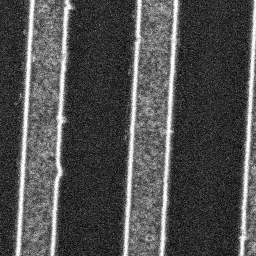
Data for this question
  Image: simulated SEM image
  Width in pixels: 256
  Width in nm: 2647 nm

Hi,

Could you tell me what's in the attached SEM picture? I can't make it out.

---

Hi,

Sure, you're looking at one or a few lines or trenches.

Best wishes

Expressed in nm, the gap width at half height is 789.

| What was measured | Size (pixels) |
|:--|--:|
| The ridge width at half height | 35.7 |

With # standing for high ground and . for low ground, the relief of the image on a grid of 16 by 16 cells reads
..##.....##.....
..##.....##.....
..##.....##.....
..##.....##.....
..##....###.....
..##....###.....
..##....###.....
..##....###.....
..##....###.....
.###....##.....#
.###....##.....#
.###....##.....#
.##.....##.....#
.##.....##.....#
.##.....##.....#
.##.....##.....#